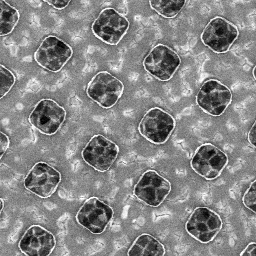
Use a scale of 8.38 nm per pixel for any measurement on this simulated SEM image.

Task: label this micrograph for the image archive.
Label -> a regular array of raised bodies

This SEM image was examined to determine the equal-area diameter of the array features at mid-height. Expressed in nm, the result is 285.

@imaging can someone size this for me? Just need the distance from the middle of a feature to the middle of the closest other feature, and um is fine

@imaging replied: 0.527